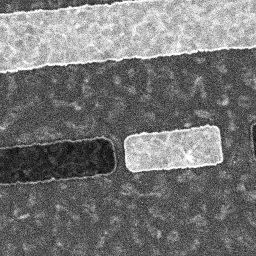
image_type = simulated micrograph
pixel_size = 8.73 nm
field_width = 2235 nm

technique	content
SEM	one or a few lines or trenches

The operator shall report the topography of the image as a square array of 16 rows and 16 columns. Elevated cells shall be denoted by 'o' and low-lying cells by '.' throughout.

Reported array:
.....ooooooooooo
oooooooooooooooo
oooooooooooooooo
oooooooooo......
................
................
................
................
........oooooo..
ooooooo.oooooo..
ooooooo.ooo.....
o...............
................
................
................
................